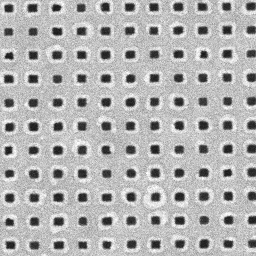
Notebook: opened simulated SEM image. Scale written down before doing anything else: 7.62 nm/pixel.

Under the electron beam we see a regular array of holes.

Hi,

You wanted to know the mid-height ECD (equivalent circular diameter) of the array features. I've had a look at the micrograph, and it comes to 79.8 nanometers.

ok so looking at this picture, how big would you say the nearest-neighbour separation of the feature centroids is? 178 nm